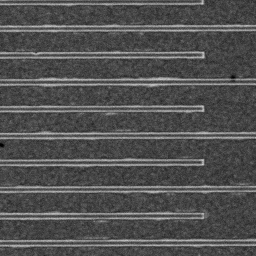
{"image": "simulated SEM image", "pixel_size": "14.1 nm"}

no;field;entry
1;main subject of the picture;parallel lines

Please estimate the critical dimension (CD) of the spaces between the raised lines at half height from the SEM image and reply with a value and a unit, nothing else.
296 nm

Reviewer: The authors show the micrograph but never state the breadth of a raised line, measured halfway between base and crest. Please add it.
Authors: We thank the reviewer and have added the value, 82.9 nm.